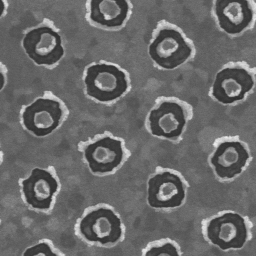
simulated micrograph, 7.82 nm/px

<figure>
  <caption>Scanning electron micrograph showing a regular array of ring-shaped grooves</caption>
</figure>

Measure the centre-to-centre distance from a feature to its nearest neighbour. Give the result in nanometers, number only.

550